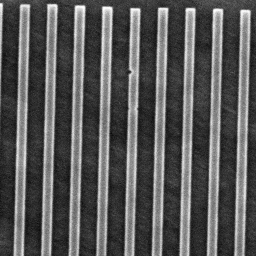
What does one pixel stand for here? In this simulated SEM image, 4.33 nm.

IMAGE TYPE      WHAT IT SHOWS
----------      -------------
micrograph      parallel lines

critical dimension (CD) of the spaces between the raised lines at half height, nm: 83.3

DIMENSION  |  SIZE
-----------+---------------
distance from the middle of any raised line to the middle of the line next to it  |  119 nanometres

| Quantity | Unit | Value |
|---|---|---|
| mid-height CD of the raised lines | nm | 37.9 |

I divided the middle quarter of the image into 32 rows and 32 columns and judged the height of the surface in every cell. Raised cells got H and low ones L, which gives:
LLLHHLLLLLHHLLLLLHHLLLLHHLLLLLHH
LLLHHLLLLLHHLLLLLHHLLLLHHLLLLLHH
LLLHHLLLLLHLLLLLLHLLLLLHHLLLLLHH
LLLHHLLLLLHLLLLLLHLLLLLHHLLLLLHH
LLHHLLLLLHHLLLLLHHLLLLLHHLLLLLHH
LLHHLLLLLHHLLLLLHHLLLLLHHLLLLLHH
LLHHLLLLLHHLLLLLHHLLLLLHHLLLLLHH
LLHHLLLLLHHLLLLLHHLLLLLHHLLLLLHH
LLHHLLLLLHHLLLLLHHLLLLLHHLLLLLHH
LLHHHLLLLHHLLLLLHHLLLLLHHLLLLLHH
LLHHHLLLLHHLLLLLHHLLLLLHHLLLLLHH
LLHHLLLLLHHLLLLLHHLLLLLHHLLLLLHH
LLHHLLLLLHHLLLLLHHLLLLLHHLLLLLHH
LLHHLLLLLHHLLLLLHHLLLLLHHLLLLLHH
LLHHLLLLLHHLLLLLHHLLLLLHHLLLLLHH
LLHHLLLLLHHLLLLLHHLLLLLHHLLLLLHH
LLHHLLLLLHHLLLLLHHLLLLLHHLLLLLHH
LLHHLLLLLHHLLLLLHHLLLLLHHLLLLLHH
LLHHLLLLLHHLLLLLHHLLLLLHHLLLLLHH
LLHHLLLLLHHLLLLLHHLLLLLHHLLLLLHH
LLHHLLLLLHHLLLLLHHLLLLLHHLLLLLHH
LLHHLLLLLHHLLLLLHHLLLLLHHLLLLLHH
LLHHLLLLLHHLLLLLHHLLLLLHHLLLLLHH
LLHHLLLLLHHLLLLLHHLLLLLHHLLLLLHH
LLHHLLLLLHHLLLLLHHLLLLLHHLLLLLHH
LLHHLLLLLHHLLLLLHHLLLLLHHLLLLLHH
LLHHLLLLLHHLLLLLHHLLLLLHHLLLLLHH
LLHHLLLLLHHLLLLLHHLLLLLHHLLLLLHH
LLHHLLLLLHHLLLLLHHLLLLLHHLLLLLHH
LLHHLLLLLHHLLLLLHHLLLLLHHLLLLLHH
LLHHLLLLLHHLLLLLHHLLLLLHHLLLLLHH
LLHHLLLLLHHLLLLLHHLLLLLHHLLLLLHH